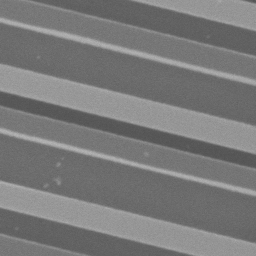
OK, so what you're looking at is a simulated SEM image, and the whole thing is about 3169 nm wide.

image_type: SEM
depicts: lines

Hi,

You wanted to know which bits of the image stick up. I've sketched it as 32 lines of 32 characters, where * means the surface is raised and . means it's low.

*****..............*************
*********.............**********
*************..............*****
....**************.............*
........**************..........
............**************......
................**************..
....................************
**......................********
******.......................***
**********......................
.*************..................
.....**************.............
*........*************..........
*****........*************......
*********........**************.
.************........***********
.....************........*******
.........************........***
.............************.......
.................************...
.....................***********
.........................*******
***..........................***
*******.........................
************....................
..**************................
......**************............
...........*************........
*..............*************....
*****.............**************
*********..............*********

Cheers